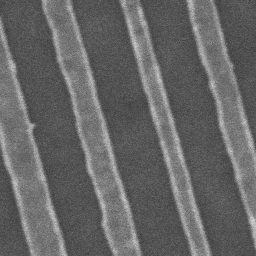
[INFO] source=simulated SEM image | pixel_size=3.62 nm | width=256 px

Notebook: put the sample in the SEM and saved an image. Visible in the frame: one or a few lines or trenches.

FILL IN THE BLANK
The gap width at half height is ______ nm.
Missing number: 172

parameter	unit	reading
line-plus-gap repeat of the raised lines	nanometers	257